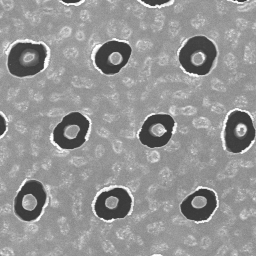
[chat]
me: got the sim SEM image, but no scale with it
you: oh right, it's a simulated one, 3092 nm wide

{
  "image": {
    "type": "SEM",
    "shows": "a regular array of ring-shaped grooves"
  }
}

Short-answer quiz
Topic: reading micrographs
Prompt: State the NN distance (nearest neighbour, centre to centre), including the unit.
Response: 1030 nanometers